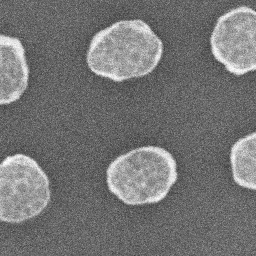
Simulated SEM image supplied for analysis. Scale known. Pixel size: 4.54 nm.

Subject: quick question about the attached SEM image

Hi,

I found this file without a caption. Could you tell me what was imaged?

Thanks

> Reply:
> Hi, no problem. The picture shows raised bodies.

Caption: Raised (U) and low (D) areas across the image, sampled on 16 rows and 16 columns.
DDDDDDDDDDDDDDDD
DDDDDDDUUDDDDDUU
DDDDDDUUUUDDDUUU
UDDDDDUUUUDDDDUU
UUDDDDUUUDDDDDDD
UUDDDDDDDDDDDDDD
DDDDDDDDDDDDDDDD
DDDDDDDDDDDDDDDD
DDDDDDDDDDDDDDDD
DDDDDDDDUUDDDDDU
UUDDDDDUUUUDDDDU
UUUDDDDUUUUDDDDU
UUUDDDDDUUDDDDDD
UUDDDDDDDDDDDDDD
DDDDDDDDDDDDDDDD
DDDDDDDDDDDDDDDD